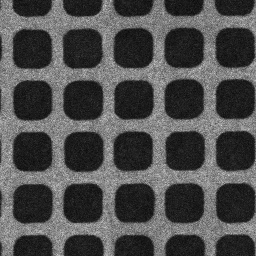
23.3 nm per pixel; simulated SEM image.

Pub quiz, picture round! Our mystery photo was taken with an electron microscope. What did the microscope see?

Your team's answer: a regular array of holes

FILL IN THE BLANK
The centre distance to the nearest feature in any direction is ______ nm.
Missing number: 1170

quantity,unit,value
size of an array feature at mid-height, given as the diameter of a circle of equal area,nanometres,998